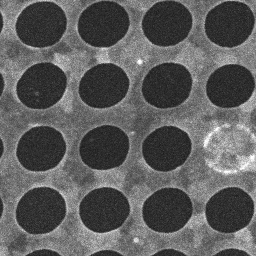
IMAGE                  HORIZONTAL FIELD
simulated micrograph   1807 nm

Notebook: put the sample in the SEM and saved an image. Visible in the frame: a regular array of holes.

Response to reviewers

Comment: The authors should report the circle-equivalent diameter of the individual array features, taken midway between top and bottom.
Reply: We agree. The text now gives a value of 0.344 micrometres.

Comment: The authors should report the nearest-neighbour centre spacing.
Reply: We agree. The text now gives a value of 437 nm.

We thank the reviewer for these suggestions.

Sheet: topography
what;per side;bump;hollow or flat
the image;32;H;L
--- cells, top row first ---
HHHHLLLHHHHHLLLHHHHLLLLHHHHLLLLH
HHHLLLLLHHLLLLLLHHLLLLLLHHLLLLLL
HHLLLLLLHHLLLLLLHHLLLLLLHHLLLLLL
HHLLLLLLHHLLLLLLHHLLLLLLHHLLLLLL
HHLLLLLLHHLLLLLLHHLLLLLHHHLLLLLH
HHHLLLLHHHHLLLHHHHHLLLHHHHHLLLHH
HHHHHHHHHHHHHHHHHHHHHHHHHHHHHHHH
HHHHHHHHHHHHHHHHHHHHHHHHHHHHHHHH
HHHHLLLLHHHLLLLHHHHLLLLHHHHLLLLH
HHHLLLLLHHLLLLLLHHLLLLLLHHLLLLLL
LHLLLLLLHHLLLLLLHHLLLLLLHHLLLLLL
HHLLLLLLHHLLLLLLHHLLLLLLHHLLLLLL
HHLLLLLLHHLLLLLHHHLLLLLHHHLLLLLH
HHHHLLHHHHHHLHHHHHHHLLHHHHHHHHHH
HHHHHHHHHHHHHHHHHHHHHHHHHHHHHHHH
HHHHHHHHHHHHHHHHHHHHHHHHHHHHHHHH
HHHLLLLHHHHLLLLLHHHLLLLHHHHHHHHH
HHLLLLLLHHLLLLLLHHLLLLLLHHHHHHHH
HHLLLLLLHHLLLLLLHHLLLLLLHHHHHHHH
HHLLLLLLHHLLLLLLHHLLLLLLHHHHHHHH
HHHLLLLHHHHLLLLHHHLLLLLHHHHHHHHH
HHHHHHHHHHHHHHHHHHHHHHHHHHHHHHHH
HHHHHHHHHHHHHHHHHHHHHHHHHHHHHHHH
HHHHLLLHHHHHLLHHHHHHLLHHHHHHLLHH
HHHLLLLLHHHLLLLLHHHLLLLLHHHLLLLH
HHLLLLLLHHLLLLLLHHLLLLLLHHLLLLLL
HHLLLLLLHHLLLLLLHHLLLLLLHHLLLLLL
HHLLLLLLHHLLLLLLHHLLLLLLHHLLLLLH
HHHLLLLHHHHLLLLHHHHLLLLHHHLLLLHH
HHHHHHHHHHHHHHHHHHHHHHHHHHHHHHHH
HHHHHHHHHHHHHHHHHHHHHHHHHHHHHHHH
HHHHLLLHHHHHLLLHHHHHLLLHHHHLLLLH